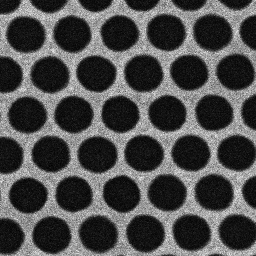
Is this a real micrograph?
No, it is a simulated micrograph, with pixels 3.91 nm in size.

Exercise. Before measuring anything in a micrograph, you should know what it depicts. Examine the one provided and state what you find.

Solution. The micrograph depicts a regular array of holes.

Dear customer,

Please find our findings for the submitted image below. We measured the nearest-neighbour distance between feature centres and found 179 nm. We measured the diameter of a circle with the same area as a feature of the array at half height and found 37.1 pixels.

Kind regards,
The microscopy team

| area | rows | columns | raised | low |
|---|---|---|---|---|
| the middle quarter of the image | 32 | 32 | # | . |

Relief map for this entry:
###.........####........###.....
.##..........##..........##.....
.##..........##..........##.....
.##..........##..........##.....
.###........####........####....
.####......#####........#####...
######....########....########..
################################
....########....########....####
......####.......#####.......###
.......###........####........##
.......###.........##..........#
.......##..........##..........#
.......##..........##..........#
.......###........####........##
......####........#####......###
.....#######.....#######....####
################################
######....#######.....#######...
#####.......####........####....
.###.........###........###.....
.###.........##..........##.....
.##..........##..........##.....
.###.........##..........##.....
.###.........###........####....
.###........#####.......#####...
######.....#######....########..
################################
....#########....######.....####
......#####.......####.......###
......####........####........##
.......###.........##..........#